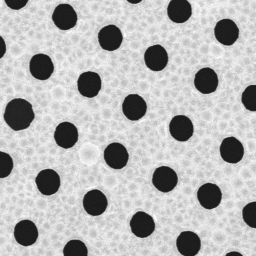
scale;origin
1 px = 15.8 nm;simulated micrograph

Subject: a regular array of holes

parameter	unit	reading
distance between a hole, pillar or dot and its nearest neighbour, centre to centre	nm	805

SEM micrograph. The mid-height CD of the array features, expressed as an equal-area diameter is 405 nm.